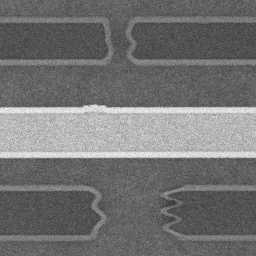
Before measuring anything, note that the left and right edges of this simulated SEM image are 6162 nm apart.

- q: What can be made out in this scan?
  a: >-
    one or a few lines or trenches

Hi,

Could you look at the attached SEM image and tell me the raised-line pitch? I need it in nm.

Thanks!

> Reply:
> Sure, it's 2100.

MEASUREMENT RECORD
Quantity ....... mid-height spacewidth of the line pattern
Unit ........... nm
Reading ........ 1160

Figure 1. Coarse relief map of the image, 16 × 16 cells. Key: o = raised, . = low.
................
oooooo..oooooooo
ooooooo.oooooooo
ooooooo.oooooooo
................
................
................
oooooooooooooooo
oooooooooooooooo
oooooooooooooooo
................
................
oooooo.....ooooo
oooooo.....ooooo
oooooo.....ooooo
................